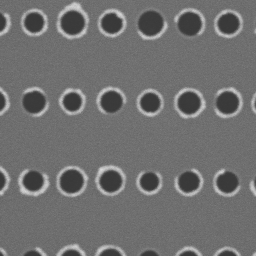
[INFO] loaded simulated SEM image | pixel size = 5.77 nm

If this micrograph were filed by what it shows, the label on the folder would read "a regular array of holes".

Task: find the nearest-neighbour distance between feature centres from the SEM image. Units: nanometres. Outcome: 223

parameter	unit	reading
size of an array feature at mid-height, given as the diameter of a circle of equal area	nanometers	128